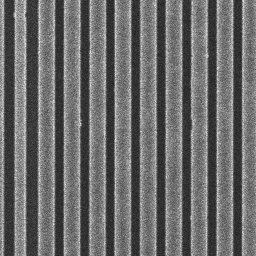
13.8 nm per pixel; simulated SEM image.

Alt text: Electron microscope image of parallel lines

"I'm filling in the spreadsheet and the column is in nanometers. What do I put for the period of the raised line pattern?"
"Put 354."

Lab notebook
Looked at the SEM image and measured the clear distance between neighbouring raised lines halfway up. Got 121 nanometres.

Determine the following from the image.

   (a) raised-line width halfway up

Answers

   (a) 16.5 pixels